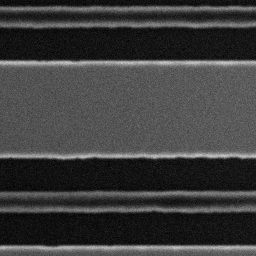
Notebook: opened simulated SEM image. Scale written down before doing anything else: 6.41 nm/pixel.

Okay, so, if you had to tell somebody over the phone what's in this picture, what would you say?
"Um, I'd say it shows lines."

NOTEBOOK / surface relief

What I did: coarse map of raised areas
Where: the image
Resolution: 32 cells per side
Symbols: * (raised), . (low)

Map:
................................
********************************
********************************
................................
................................
................................
................................
................................
********************************
********************************
********************************
********************************
********************************
********************************
********************************
********************************
********************************
********************************
********************************
********************************
................................
................................
................................
................................
...........*********************
********************************
................................
................................
................................
................................
................................
********************************